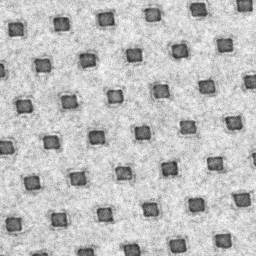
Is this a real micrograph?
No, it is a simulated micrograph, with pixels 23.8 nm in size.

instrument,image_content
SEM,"a regular array of holes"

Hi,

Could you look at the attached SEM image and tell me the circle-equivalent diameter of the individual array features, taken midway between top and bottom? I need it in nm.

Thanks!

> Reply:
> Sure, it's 426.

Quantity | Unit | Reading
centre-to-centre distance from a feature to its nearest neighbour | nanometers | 1070